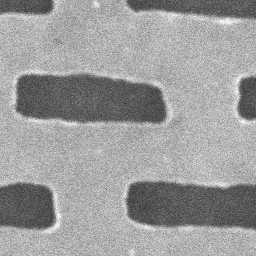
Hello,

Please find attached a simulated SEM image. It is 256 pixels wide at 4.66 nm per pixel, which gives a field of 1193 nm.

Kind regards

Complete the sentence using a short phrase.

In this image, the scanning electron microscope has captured holes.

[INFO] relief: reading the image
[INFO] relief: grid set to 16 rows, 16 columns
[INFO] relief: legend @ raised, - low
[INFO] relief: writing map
---@@@@@--------
@@@@@@@@@@@@@@@@
@@@@@@@@@@@@@@@@
@@@@@@@@@@@@@@@@
@@@@@@@@@@@@@@@@
@---------@@@@@-
@---------@@@@@-
@@@-------@@@@@@
@@@@@@@@@@@@@@@@
@@@@@@@@@@@@@@@@
@@@@@@@@@@@@@@@@
@-@@@@@@----@@@-
---@@@@@--------
---@@@@@--------
@@@@@@@@@@@@@@@@
@@@@@@@@@@@@@@@@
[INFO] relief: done